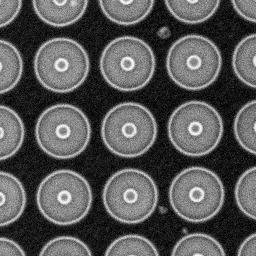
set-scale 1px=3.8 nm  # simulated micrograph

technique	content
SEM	an array of small figures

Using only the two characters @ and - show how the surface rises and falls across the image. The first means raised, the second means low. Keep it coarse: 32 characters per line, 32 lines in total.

--@@---@---@@------@@------@@---
--@@@-----@@@-----@@@@----@@@@--
-@@@@@---@@@@@---@@@@@@--@@@@@@@
@@@@@@@@@@@@@@@@@@@@@@@@@@@@@@@@
@@@@@@@@@@@@@@@@@@@@@@@@@@@@@@@@
-@@@@@---@@@@@----@@@@----@@@@--
--@@@-----@@@------@@------@@@--
---@@--@---@@--@---@@---@--@@---
---@@--@---@@------@@------@@---
--@@@------@@------@@@-----@@@--
--@@@@----@@@@----@@@@@---@@@@@-
@@@@@@@@@@@@@@@@@@@@@@@@@@@@@@@@
@@@@@@@@@@@@@@@@@@@@@@@@@@@@@@@@
@@@@@@@--@@@@@@---@@@@@---@@@@@-
--@@@-----@@@@-----@@@-----@@@--
---@@------@@------@@---@---@@--
---@@--@@--@@--@@--@@---@---@@--
---@@------@@------@@@-----@@@--
--@@@@----@@@@----@@@@----@@@@@-
-@@@@@@--@@@@@@@@@@@@@@@@@@@@@@@
@@@@@@@@@@@@@@@@@@@@@@@@@@@@@@@@
@@@@@@@@@@@@@@@--@@@@@@---@@@@@-
--@@@@----@@@@-----@@@-----@@@--
---@@------@@------@@@------@@--
---@@--@@--@@---@--@@---@---@@--
---@@------@@------@@@------@@--
---@@------@@@-----@@@-----@@@@-
-@@@@@@---@@@@@--@@@@@@@@@@@@@@@
@@@@@@@@@@@@@@@@@@@@@@@@@@@@@@@@
@@@@@@@@@@@@@@@@@@@@@@@@-@@@@@@@
--@@@@----@@@@-----@@@-----@@@@-
---@@------@@@-----@@@------@@--